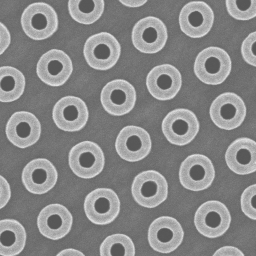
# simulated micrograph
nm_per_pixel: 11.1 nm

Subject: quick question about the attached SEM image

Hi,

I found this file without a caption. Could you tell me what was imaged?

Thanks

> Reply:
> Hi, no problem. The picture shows a regular array of ring-shaped raised bodies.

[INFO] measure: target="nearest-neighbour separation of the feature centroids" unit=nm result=543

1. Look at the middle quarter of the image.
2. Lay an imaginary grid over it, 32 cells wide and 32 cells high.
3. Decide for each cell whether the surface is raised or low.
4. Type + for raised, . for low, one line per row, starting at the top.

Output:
++.....+++++...........++++.....
++....................++++++....
++...................++++++++...
+....................++....++...
...........+++++.....++....++...
..........+++++++....+++...++...
..........++..++++...++++++++...
.........+++...+++....++++++....
++++.....++....+++.....++++.....
+++++....+++...+++..............
+..+++....+++++++...............
...+++....+++++++...........+++.
....++.......++...........++++++
...+++...................+++++++
+++++....................+++...+
+++++....................++....+
++++..........++++++.....++....+
..............+++++++....+++..++
.............+++...+++....++++++
.....++......+++...+++.....++++.
...++++++....+++...+++..........
..+++++++....+++...+++..........
.+++...+++....+++++++...........
.+++....++.....+++++...........+
.+++....++....................++
.+++...+++...................+++
..+++++++....................++.
...+++++...........+++++.....++.
..................+++++++....+++
.................++++.++++...+++
.................+++...+++....++
........++++.....++....+++......